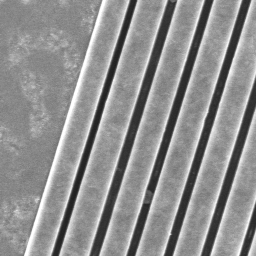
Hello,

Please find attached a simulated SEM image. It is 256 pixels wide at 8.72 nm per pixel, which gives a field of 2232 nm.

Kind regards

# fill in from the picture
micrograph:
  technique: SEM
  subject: parallel lines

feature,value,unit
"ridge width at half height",231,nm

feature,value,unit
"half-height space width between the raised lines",0.0771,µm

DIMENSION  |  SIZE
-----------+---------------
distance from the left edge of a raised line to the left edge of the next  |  0.31 microns